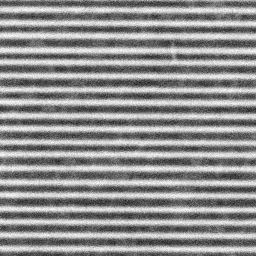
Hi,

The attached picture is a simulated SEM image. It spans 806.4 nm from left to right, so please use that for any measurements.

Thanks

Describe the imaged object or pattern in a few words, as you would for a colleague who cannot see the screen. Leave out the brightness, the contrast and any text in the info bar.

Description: parallel lines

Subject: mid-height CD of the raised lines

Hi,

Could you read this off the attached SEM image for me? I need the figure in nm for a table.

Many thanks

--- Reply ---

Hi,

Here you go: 14.2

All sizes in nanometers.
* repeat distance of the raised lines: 41.9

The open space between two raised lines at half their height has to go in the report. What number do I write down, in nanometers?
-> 28